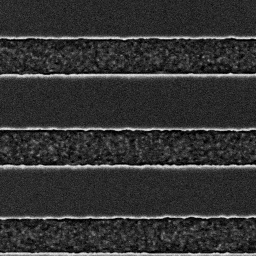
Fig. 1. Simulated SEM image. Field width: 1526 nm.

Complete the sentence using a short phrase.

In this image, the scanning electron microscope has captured lines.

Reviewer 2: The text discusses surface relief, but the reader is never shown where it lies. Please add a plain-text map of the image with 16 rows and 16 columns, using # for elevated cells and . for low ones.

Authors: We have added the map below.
################
################
................
................
................
################
################
################
................
................
################
################
################
################
................
................